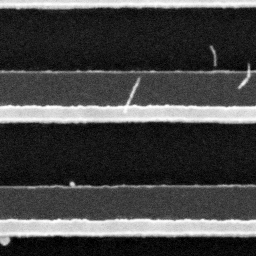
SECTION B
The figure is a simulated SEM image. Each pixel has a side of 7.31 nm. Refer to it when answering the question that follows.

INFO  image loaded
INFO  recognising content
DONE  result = lines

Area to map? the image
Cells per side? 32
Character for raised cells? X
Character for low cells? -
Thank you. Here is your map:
XXXXXXXXXXXXXXXXXXXXXXXXXXXXXXXX
--------------------------------
--------------------------------
--------------------------------
--------------------------------
--------------------------------
--------------------------------
--------------------------------
--------------------------------
XXXXXXXXXXXXXXXXXXXXXXXXXXXXXXXX
XXXXXXXXXXXXXXXXXXXXXXXXXXXXXXXX
XXXXXXXXXXXXXXXXXXXXXXXXXXXXXXXX
XXXXXXXXXXXXXXXXXXXXXXXXXXXXXXXX
XXXXXXXXXXXXXXXXXXXXXXXXXXXXXXXX
XXXXXXXXXXXXXXXXXXXXXXXXXXXXXXXX
--------------------------------
--------------------------------
--------------------------------
--------------------------------
--------------------------------
--------------------------------
--------------------------------
--------------------------------
XXXXXXXXXXXXXXXXXXXXXXXXXXXXXXXX
XXXXXXXXXXXXXXXXXXXXXXXXXXXXXXXX
XXXXXXXXXXXXXXXXXXXXXXXXXXXXXXXX
XXXXXXXXXXXXXXXXXXXXXXXXXXXXXXXX
XXXXXXXXXXXXXXXXXXXXXXXXXXXXXXXX
XXXXXXXXXXXXXXXXXXXXXXXXXXXXXXXX
--------------------------------
--------------------------------
--------------------------------